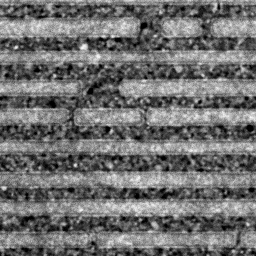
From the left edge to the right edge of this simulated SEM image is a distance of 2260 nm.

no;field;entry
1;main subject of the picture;parallel lines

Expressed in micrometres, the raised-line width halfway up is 0.134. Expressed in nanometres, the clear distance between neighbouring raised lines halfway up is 132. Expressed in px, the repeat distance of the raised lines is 30.4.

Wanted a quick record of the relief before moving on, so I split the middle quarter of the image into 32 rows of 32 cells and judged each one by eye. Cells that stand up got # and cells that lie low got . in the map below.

################################
################################
################################
################################
....##########..................
....##########..................
....##########..................
....##########..................
################################
################################
################################
.##................##...........
.#..................#...........
.#..................#...........
.##.................#...........
################################
################################
################################
################################
................................
................................
................................
..............................##
################################
################################
################################
################################
................................
................................
................................
................................
################################